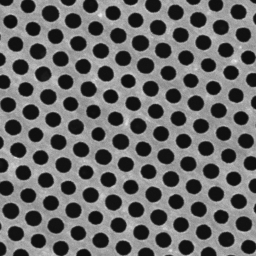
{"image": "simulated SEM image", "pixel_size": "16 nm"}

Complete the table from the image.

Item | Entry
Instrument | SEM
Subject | a regular array of holes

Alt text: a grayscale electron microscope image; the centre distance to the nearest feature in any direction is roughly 0.368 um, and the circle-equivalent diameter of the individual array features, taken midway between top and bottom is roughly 252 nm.